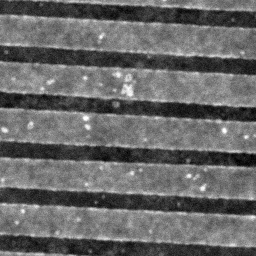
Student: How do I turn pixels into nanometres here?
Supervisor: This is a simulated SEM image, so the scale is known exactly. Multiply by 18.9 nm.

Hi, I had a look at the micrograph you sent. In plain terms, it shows lines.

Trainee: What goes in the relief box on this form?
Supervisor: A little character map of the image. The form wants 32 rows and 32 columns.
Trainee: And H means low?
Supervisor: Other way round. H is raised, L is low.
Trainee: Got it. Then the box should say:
LLLLLLLLLLLLHHHHHHHHHHHHHHHHHHHH
LLLLLLLLLLLLLLLLLLLLLLLLLLLLLLLL
HHHHHHHHHHLLLLLLLLLLLLLLLLLLLLLL
HHHHHHHHHHHHHHHHHHHHHHHHHHHHHLLL
HHHHHHHHHHHHHHHHHHHHHHHHHHHHHHHH
HHHHHHHHHHHHHHHHHHHHHHHHHHHHHHHH
LLLLLLLLLLLLLLLLHHHHHHHHHHHHHHHH
LLLLLLLLLLLLLLLLLLLLLLLLLLLLLLLL
HHHHHHHHHHHHHLLLLLLLLLLLLLLLLLLL
HHHHHHHHHHHHHHHHHHHHHHHHHHHHHHHL
HHHHHHHHHHHHHHHHHHHHHHHHHHHHHHHH
LHHHHHHHHHHHHHHHHHHHHHHHHHHHHHHH
LLLLLLLLLLLLLLLLLHHHHHHHHHHHHHHH
LLLLLLLLLLLLLLLLLLLLLLLLLLLLLLLL
HHHHHHHHHHHHHHHHHLLLLLLLLLLLLLLL
HHHHHHHHHHHHHHHHHHHHHHHHHHHHHHHH
HHHHHHHHHHHHHHHHHHHHHHHHHHHHHHHH
HHHHHHHHHHHHHHHHHHHHHHHHHHHHHHHH
LLLLLLLLLLLLLLLLLLLLHHHHHHHHHHHH
LLLLLLLLLLLLLLLLLLLLLLLLLLLLLLLL
HHHHHHHHHHHHHHHHHHLLLLLLLLLLLLLL
HHHHHHHHHHHHHHHHHHHHHHHHHHHHHHHH
HHHHHHHHHHHHHHHHHHHHHHHHHHHHHHHH
LLLLLHHHHHHHHHHHHHHHHHHHHHHHHHHH
LLLLLLLLLLLLLLLLLLLLLLLLHHHHHHHH
HLLLLLLLLLLLLLLLLLLLLLLLLLLLLLLL
HHHHHHHHHHHHHHHHHHHHHLLLLLLLLLLL
HHHHHHHHHHHHHHHHHHHHHHHHHHHHHHHH
HHHHHHHHHHHHHHHHHHHHHHHHHHHHHHHH
LLLLLLHHHHHHHHHHHHHHHHHHHHHHHHHH
LLLLLLLLLLLLLLLLLLLLLLLLLLHHHHHH
LLLLLLLLLLLLLLLLLLLLLLLLLLLLLLLL